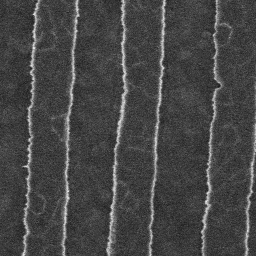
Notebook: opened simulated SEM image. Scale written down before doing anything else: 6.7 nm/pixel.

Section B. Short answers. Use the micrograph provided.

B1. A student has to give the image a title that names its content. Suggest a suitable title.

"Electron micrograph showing one or a few lines or trenches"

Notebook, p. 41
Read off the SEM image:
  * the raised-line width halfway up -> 272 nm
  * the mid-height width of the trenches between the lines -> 340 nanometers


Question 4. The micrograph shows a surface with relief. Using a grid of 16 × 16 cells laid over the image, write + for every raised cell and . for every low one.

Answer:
..+++...++....++
..+++...++...+++
..+++...++...+++
..+++...++...+++
..+++...++...+++
..++....++....++
..++....++...+++
..++....++...+++
..++...+++...+++
..++...+++...+++
..++...+++...+++
..++...+++...+++
..++...+++...+++
..++...+++...++.
..++...++....+++
.+++...++....++.